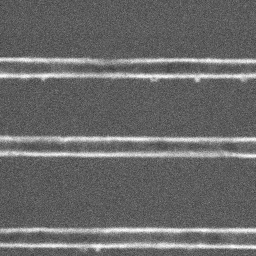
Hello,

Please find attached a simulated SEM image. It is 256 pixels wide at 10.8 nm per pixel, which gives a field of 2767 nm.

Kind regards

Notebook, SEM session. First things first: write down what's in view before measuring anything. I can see lines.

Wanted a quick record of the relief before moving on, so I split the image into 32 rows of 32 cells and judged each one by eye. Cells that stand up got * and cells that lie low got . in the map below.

................................
................................
................................
................................
................................
................................
................................
***.............................
********************************
******.****.**.*****************
................................
................................
................................
................................
................................
................................
................................
********************************
********************************
................................
................................
................................
................................
................................
................................
................................
................................
................................
................................
********************************
********************************
................................